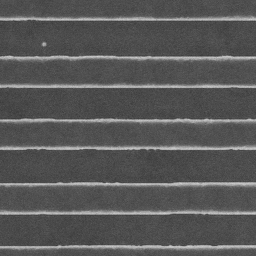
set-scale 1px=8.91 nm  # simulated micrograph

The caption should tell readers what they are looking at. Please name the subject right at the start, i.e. lines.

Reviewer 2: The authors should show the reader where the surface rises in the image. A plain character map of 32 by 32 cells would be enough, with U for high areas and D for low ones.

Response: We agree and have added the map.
UUUUUUUUUUUUUUUUUUUUUUUUUUUUUUUU
UUUUUUUUUUUUUUUUUUUUUUUUUUUUUUUU
DDDDDDDDDDDDDDDDDDDDDDDDDDDDDDDD
DDDDDDDDDDDDDDDDDDDDDDDDDDDDDDDD
DDDDDDDDDDDDDDDDDDDDDDDDDDDDDDDD
DDDDDDDDDDDDDDDDDDDDDDDDDDDDDDDD
DDDDDDDDDDDDDDDDDDDDDDDDDDDDDDDD
UUUUUUUUUUUUUUUUUUUUUUUUUUUUUUUU
UUUUUUUUUUUUUUUUUUUUUUUUUUUUUUUU
UUUUUUUUUUUUUUUUUUUUUUUUUUUUUUUU
UUUUUUUUUUUUUUUUUUUUUUUUUUUUUUUU
DDDDDDDDDDDDDDDDDDDDDDDDDDDDDDDD
DDDDDDDDDDDDDDDDDDDDDDDDDDDDDDDD
DDDDDDDDDDDDDDDDDDDDDDDDDDDDDDDD
DDDDDDDDDDDDDDDDDDDDDDDDDDDDDDDD
UUUUUUUUUUUUUUUUUUUUUUUUUUUUUUUU
UUUUUUUUUUUUUUUUUUUUUUUUUUUUUUUU
UUUUUUUUUUUUUUUUUUUUUUUUUUUUUUUU
UUUUUUUUUUUUUUUUUUUUUUUUUUUUUUUU
DDDDDDDDDDDDDDDDDDDDDDDDDDDDDDDD
DDDDDDDDDDDDDDDDDDDDDDDDDDDDDDDD
DDDDDDDDDDDDDDDDDDDDDDDDDDDDDDDD
DDDDDDDDDDDDDDDDDDDDDDDDDDDDDDDD
UUUUUUUUUUUUUUUUUUUUUUUUUUUUUUUU
UUUUUUUUUUUUUUUUUUUUUUUUUUUUUUUU
UUUUUUUUUUUUUUUUUUUUUUUUUUUUUUUU
UUUUUUUUUUUUUUUUUUUUUUUUUUUUUUUU
DDDDDDDDDDDDDDDDDDDDDDDDDDDDDDDD
DDDDDDDDDDDDDDDDDDDDDDDDDDDDDDDD
DDDDDDDDDDDDDDDDDDDDDDDDDDDDDDDD
DDDDDDDDDDDDDDDDDDDDDDDDDDDDDDDD
UUUUUUUUUUUUUUUUUUUUUUUUUUUUUUUU